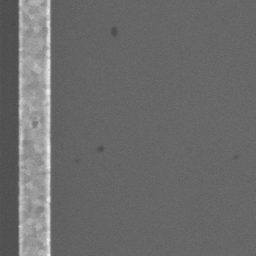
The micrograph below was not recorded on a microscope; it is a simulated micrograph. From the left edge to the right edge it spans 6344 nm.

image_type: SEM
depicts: lines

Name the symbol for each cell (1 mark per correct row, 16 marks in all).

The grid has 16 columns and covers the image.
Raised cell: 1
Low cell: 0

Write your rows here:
0110000000000000
0110000000000000
0110000000000000
0110000000000000
0110000000000000
0110000000000000
0110000000000000
0110000000000000
0110000000000000
0110000000000000
0110000000000000
0110000000000000
0110000000000000
0110000000000000
0110000000000000
0110000000000000